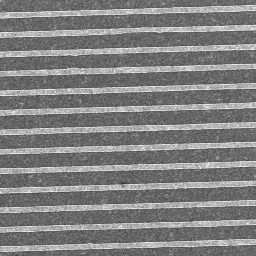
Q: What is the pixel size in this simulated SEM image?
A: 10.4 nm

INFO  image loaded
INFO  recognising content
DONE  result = parallel lines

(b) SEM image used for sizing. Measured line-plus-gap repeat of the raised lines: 19.5 px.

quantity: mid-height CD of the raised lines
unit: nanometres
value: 54.6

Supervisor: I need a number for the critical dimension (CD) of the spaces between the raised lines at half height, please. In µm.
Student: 0.148